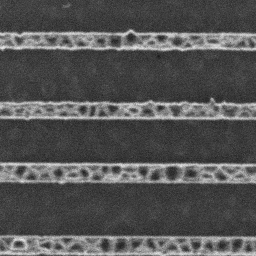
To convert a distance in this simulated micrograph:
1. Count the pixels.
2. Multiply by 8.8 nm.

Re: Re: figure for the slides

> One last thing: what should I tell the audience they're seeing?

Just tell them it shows one or a few lines or trenches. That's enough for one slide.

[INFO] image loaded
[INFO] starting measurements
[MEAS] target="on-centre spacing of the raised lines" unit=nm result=599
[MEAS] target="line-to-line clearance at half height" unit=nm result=484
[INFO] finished